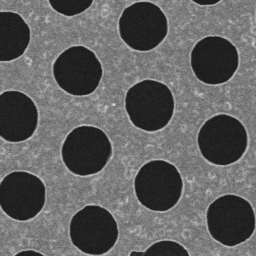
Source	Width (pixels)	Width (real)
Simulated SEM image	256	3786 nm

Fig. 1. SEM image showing a regular array of holes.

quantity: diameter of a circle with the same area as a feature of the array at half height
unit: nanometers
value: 729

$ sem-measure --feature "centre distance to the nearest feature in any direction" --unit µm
1.16